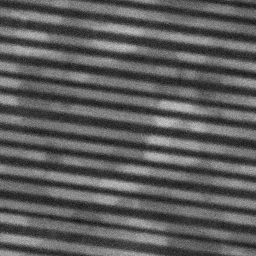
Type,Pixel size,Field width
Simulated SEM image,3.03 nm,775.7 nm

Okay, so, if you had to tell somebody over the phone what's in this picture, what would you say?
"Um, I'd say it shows parallel lines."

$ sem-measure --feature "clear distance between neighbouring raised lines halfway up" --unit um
0.0269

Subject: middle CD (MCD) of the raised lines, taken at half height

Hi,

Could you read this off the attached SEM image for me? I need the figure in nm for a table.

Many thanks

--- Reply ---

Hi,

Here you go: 24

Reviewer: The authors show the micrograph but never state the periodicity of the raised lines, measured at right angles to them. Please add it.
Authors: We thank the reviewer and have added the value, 17.1 px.